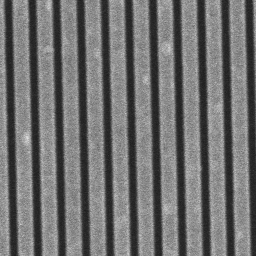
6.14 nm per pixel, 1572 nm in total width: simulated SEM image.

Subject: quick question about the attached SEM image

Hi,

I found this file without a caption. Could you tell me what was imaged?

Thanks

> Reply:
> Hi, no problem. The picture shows parallel lines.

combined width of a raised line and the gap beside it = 148 nanometres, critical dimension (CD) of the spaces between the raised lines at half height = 0.0545 um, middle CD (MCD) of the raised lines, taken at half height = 92.8 nanometers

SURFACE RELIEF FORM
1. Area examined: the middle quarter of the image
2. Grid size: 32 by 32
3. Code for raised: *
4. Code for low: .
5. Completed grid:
***...***...***...***...***...**
***...***...***...***...***...**
***...***...***...***...***...**
***...***...***...***...***...**
***...***...***...***...***...**
***...***...***...***...****..**
***...***...***...****..****..**
***...***...***...***...****..**
***...***...***...***...****..**
***...***...***...***...****..**
***...***...***...***...****..**
****..****..****..****..****..**
****..****..****..****..****..**
****..****..****..****..****..**
****..****..****..****..****..**
****..****..****..****..****..**
****..****..****..****..****..**
****..****..****..****..****..**
****..****..****..****..****..**
****..****..****..****..****..**
****..****..****..****..****..**
****..****..****..****..****..**
****..****..****..****..****..**
****..****..****..****..****..**
****..****..****..****..****..**
****..****..****..****..****..**
****..****..****..****..****..**
****..****..****..****..****..**
****..****..****..****..****..**
****..****..****..****..****..**
****..****..****..****..****..**
****..****..****..****..****..**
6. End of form